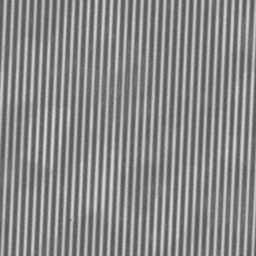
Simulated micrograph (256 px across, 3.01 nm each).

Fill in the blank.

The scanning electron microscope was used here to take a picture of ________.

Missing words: parallel lines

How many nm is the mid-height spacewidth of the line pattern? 15.4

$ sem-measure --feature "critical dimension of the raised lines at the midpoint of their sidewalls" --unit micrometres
0.0075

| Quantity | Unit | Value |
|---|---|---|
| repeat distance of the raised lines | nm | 22.8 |